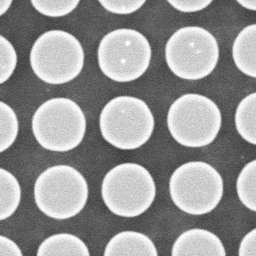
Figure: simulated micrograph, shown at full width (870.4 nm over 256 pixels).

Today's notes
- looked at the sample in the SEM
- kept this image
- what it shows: an array of small figures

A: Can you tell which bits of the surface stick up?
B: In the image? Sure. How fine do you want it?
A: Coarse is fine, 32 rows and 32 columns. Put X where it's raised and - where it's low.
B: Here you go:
X---XXXXXX---XXXXX---XXXXX----XX
X----XXXX-----XX----------------
--------------------------------
-----------------------XX------X
-----XXXX----XXXXX----XXXXX---XX
X---XXXXXX---XXXXXX--XXXXXX--XXX
XX--XXXXXX--XXXXXXX--XXXXXX--XXX
XX--XXXXXX--XXXXXXX--XXXXXX--XXX
XX--XXXXXX---XXXXX---XXXXXX---XX
X----XXXXX---XXXX-----XXXX-----X
--------------------------------
--------------------------------
------XXX-----XXX-----XXXX----XX
X----XXXXX---XXXXX---XXXXXX---XX
XX--XXXXXXX--XXXXXX--XXXXXXX-XXX
XX--XXXXXXX--XXXXXX--XXXXXXX-XXX
XX--XXXXXXX--XXXXXX--XXXXXX---XX
XX---XXXXX---XXXXX----XXXXX----X
X-----XXX------XX---------------
--------------------------------
---------------XX------XXX-----X
X-----XXXX----XXXX----XXXXX---XX
XX---XXXXXX--XXXXXX--XXXXXXX--XX
XX--XXXXXXX--XXXXXX--XXXXXXX--XX
XXX-XXXXXXX--XXXXXX--XXXXXXX--XX
XX---XXXXXX--XXXXXX---XXXXX----X
XX---XXXXX----XXXX-----XXX------
--------------------------------
--------------------------------
-------XX-----XXXX-----XXXX----X
XX---XXXXXX---XXXXX---XXXXXX--XX
XXX--XXXXXX--XXXXXXX--XXXXXX--XX